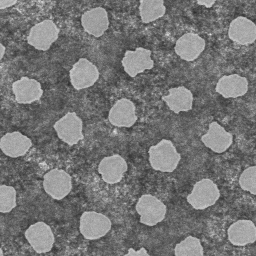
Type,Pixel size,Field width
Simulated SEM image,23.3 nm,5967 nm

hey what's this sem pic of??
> a regular array of raised bodies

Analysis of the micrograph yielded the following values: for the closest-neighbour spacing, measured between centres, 1270 nanometers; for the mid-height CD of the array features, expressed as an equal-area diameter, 659 nanometres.